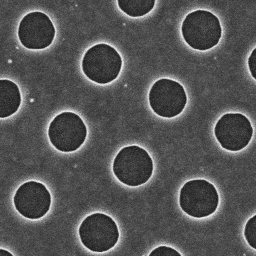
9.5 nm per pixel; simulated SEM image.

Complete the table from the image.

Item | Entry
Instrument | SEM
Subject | a regular array of holes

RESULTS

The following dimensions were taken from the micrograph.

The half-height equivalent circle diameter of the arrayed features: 374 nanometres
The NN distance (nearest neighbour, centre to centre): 700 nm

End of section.